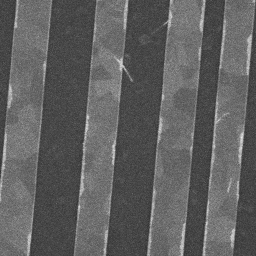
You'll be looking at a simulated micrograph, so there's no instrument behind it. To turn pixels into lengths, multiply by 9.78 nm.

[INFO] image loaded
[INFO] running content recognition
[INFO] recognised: one or a few lines or trenches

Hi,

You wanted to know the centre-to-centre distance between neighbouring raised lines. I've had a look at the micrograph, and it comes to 655 nanometres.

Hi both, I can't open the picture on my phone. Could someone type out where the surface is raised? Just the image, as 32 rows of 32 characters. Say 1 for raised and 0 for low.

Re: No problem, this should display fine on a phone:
00111100000011110000011111001111
00111100000011110000011111001111
00111100000011110000011110001111
00111100000011110000011110001111
00111100000011110000011110001110
00111100000011100000011110001110
00111100000011100000011110001110
01111100000111110000011110001110
01111100000111100000011110011110
01111100000111100000111110011110
01111100000111100000111110011110
01111000000111100000111110011110
01111000000111100000111110011110
01111000000111100000111100011110
01111000000111100000111100011110
01111000000111100000111100011110
01111000000111100000111100011100
01111000001111000000111100011100
11111000001111000000111100011100
11111000001111000000111100011100
11111000001111000000111100111100
11111000001111000001111100111100
11110000001111000001111100111100
11110000001111000001111100111100
11110000001111000001111000111100
11110000001111000001111000111100
11110000001111000001111000111100
11110000001111000001111000111000
11110000001111000001111000111000
11110000011110000001111000111000
11110000011110000001111001111000
11110000011110000011111001111000